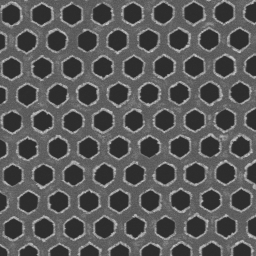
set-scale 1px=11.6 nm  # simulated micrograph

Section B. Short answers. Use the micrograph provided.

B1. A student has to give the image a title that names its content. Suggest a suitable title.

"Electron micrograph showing a regular array of holes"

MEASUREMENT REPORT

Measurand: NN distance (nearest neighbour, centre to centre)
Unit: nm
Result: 352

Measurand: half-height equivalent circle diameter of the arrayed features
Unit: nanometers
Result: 225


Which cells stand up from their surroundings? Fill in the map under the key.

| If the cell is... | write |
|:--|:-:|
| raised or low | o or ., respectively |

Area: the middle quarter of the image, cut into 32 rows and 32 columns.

.....oo.....ooo.....ooo....ooo..
.....oo.....ooo.....ooo....ooo..
....oooo...ooooo...oooo...ooooo.
oooooooooooooooooooooooooooooooo
oooooooooooooooooooooooooooooooo
ooooo..ooooo...ooooo...ooooo..oo
.ooo....ooo.....ooo.....oo.....o
.ooo....ooo.....ooo.....oo.....o
.ooo....ooo.....ooo....oooo....o
oooo...ooooo...ooooo..oooooo..oo
oooooooooooooooooooooooooooooooo
oooooooooooooooooooooooooooooooo
o...oooo....oooo...oooo....oooo.
....ooo.....ooo.....ooo.....oo..
.....oo.....ooo.....ooo....ooo..
....oooo....oooo....ooo....oooo.
o..oooooo.ooooooo.ooooooo.oooooo
oooooooooooooooooooooooooooooooo
oooooo.oooooo.ooooooo.oooooo..oo
oooo....oooo....ooo....oooo....o
.ooo....ooo.....ooo.....ooo....o
.ooo.....oo.....ooo.....ooo....o
oooo....oooo....oooo...oooo....o
oooooo.ooooooooooooooooooooooooo
oooooooooooooooooooooooooooooooo
oo.oooooo..oooooo..ooooo...ooooo
.....ooo....ooo.....ooo.....oo..
.....ooo....ooo.....ooo.....oo..
.....ooo....ooo.....ooo.....oo..
o...oooo...ooooo...ooooo...ooooo
oooooooooooooooooooooooooooooooo
oooooooooooooooooooooooooooooooo